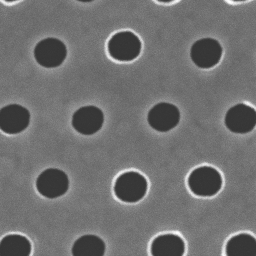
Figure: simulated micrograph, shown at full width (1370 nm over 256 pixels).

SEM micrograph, a regular array of holes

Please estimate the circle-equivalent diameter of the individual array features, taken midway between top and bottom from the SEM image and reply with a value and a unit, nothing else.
169 nanometers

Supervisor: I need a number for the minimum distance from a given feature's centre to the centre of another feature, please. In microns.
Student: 0.401